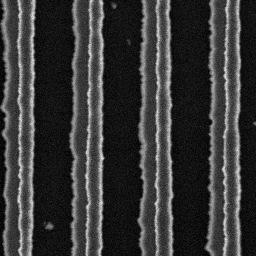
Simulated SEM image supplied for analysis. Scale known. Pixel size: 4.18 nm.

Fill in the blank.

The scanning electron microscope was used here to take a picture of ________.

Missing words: lines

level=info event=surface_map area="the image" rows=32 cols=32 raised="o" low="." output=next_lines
oooo.....oooo.....ooo.....oooo..
.ooo.....oooo.....ooo.....oooo..
oooo.....oooo.....ooo.....oooo..
oooo.....oooo.....ooo.....oooo..
.ooo.....oooo.....ooo.....oooo..
.ooo.....oooo.....ooo.....oooo..
.ooo.....oooo.....ooo.....oooo..
.ooo.....oooo.....ooo.....oooo..
.ooo.....oooo.....ooo.....oooo..
.ooo.....oooo.....ooo.....oooo..
.ooo.....oooo.....ooo......ooo..
.ooo.....oooo.....ooo......ooo..
.ooo.....oooo.....ooo......ooo..
oooo.....oooo.....ooo.....oooo..
.ooo.....oooo.....ooo.....oooo..
.ooo.....oooo.....ooo......ooo..
oooo.....oooo.....ooo.....oooo..
.ooo.....oooo.....ooo.....oooo..
.ooo.....oooo.....ooo.....oooo..
.ooo.....oooo.....ooo.....oooo..
.ooo.....oooo.....ooo.....oooo..
.ooo.....oooo.....ooo.....oooo..
.ooo.....oooo.....ooo.....oooo..
.ooo.....oooo.....ooo.....oooo..
.ooo.....oooo.....oooo....oooo..
.ooo.....oooo.....ooo.....oooo..
.ooo.....oooo.....ooo.....oooo..
.ooo.....oooo....ooooo....oooo..
.ooo.....oooo.....oooo....oooo..
oooo.....oooo.....oooo....oooo..
.ooo.....oooo.....oooo....oooo..
.ooo.....oooo.....oooo....oooo..